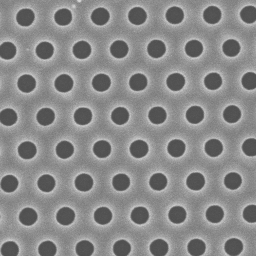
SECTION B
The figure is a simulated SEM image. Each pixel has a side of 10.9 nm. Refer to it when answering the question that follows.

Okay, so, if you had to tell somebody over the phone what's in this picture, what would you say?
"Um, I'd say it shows a regular array of holes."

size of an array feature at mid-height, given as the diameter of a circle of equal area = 0.202 microns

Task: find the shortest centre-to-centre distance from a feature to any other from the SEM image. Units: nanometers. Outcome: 406